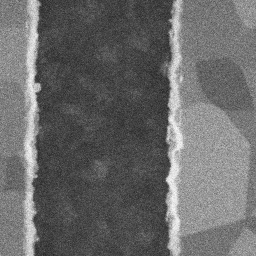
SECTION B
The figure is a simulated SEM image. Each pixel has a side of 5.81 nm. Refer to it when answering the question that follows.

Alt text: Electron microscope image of one or a few lines or trenches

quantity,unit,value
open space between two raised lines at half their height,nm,833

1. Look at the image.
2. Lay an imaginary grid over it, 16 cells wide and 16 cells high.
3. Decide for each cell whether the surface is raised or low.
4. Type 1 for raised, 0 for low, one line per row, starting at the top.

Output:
1100000000011111
1100000000011111
1100000000011111
1100000000011111
1100000000011111
1100000000011111
1100000000011111
1100000000011111
1100000000011111
1100000000011111
1100000000011111
1100000000011111
1100000000011111
1100000000011111
1100000000011111
1100000000011111